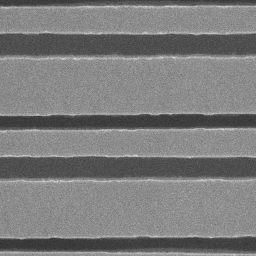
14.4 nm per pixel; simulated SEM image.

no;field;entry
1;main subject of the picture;lines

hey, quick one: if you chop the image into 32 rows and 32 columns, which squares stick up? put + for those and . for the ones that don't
................................
++++++++++++++++++++++++++++++++
++++++++++++++++++++++++++++++++
++++++++++++++++++++++++++++++++
................................
................................
................................
++++++++++++++++++++++++++++++++
++++++++++++++++++++++++++++++++
++++++++++++++++++++++++++++++++
++++++++++++++++++++++++++++++++
++++++++++++++++++++++++++++++++
++++++++++++++++++++++++++++++++
++++++++++++++++++++++++++++++++
................................
................................
++++++++++++++++++++++++++++++++
++++++++++++++++++++++++++++++++
++++++++++++++++++++++++++++++++
++++++++++...+++++++++++++++++++
................................
................................
..................++..+.++++...+
++++++++++++++++++++++++++++++++
++++++++++++++++++++++++++++++++
++++++++++++++++++++++++++++++++
++++++++++++++++++++++++++++++++
++++++++++++++++++++++++++++++++
++++++++++++++++++++++++++++++++
++++++++++++++++++++++++++++++..
................................
++++..++........................